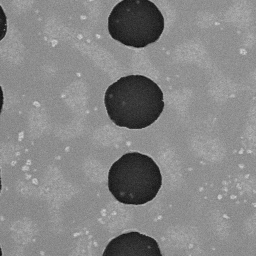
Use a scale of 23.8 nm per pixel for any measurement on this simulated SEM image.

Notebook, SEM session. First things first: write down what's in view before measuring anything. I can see holes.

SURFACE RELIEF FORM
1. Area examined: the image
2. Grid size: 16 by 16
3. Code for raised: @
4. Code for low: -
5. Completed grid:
@@@@@@@---@@@@@@
@@@@@@@---@@@@@@
@@@@@@@---@@@@@@
@@@@@@@@@@@@@@@@
@@@@@@@@@@@@@@@@
@@@@@@@---@@@@@@
@@@@@@@---@@@@@@
@@@@@@@---@@@@@@
@@@@@@@@@@@@@@@@
@@@@@@@@@@@@@@@@
@@@@@@@---@@@@@@
@@@@@@@---@@@@@@
@@@@@@@--@@@@@@@
@@@@@@@@@@@@@@@@
@@@@@@@@@@@@@@@@
@@@@@@@---@@@@@@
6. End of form